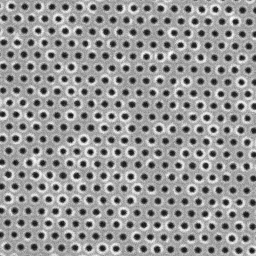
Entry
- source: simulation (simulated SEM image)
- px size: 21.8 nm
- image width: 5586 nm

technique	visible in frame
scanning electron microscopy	a regular array of holes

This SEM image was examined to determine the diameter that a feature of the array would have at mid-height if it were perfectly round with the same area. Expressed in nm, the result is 169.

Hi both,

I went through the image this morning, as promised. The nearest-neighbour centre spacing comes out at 292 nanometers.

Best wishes